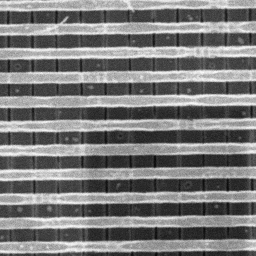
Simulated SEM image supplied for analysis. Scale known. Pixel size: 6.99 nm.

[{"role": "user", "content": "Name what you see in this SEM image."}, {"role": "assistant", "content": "wiring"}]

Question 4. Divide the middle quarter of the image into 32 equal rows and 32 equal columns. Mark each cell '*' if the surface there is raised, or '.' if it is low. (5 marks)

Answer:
................................
................................
********************************
********************************
**..............................
................................
................................
................................
********************************
********************************
*******....**..*****............
................................
................................
................................
*******...***.****************..
*******************************.
*******..............**.........
................................
................................
................................
****.*..************************
********************************
***************************.....
................................
................................
................................
.*******************************
********************************
*************..*.*.........**...
................................
................................
................................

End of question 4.